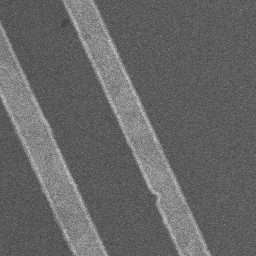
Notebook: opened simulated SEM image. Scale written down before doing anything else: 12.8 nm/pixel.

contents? one or a few lines or trenches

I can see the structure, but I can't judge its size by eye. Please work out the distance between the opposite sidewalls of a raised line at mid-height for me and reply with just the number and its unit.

310 nm